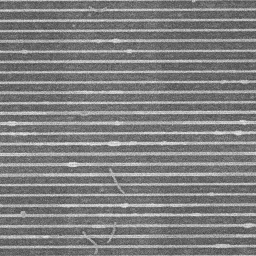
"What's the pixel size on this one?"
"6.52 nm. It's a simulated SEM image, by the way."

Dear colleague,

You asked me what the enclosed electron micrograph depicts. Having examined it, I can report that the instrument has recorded parallel lines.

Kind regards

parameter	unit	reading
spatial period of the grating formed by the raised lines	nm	67.1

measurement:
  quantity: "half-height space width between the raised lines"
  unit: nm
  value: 49.3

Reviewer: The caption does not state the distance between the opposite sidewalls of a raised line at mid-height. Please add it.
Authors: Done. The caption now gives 17.9 nm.